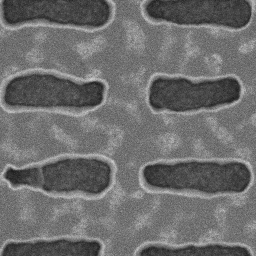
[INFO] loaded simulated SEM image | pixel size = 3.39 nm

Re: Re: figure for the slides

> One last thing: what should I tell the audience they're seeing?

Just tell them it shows holes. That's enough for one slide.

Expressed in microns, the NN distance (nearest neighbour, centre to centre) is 0.285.